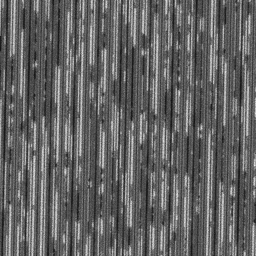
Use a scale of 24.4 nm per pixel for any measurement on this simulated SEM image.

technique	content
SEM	parallel lines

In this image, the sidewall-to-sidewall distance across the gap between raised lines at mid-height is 48.9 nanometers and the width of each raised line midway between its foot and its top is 97.8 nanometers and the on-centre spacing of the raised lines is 5.73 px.